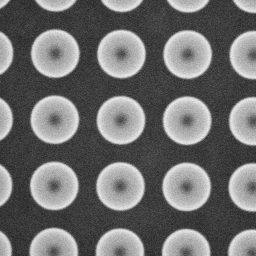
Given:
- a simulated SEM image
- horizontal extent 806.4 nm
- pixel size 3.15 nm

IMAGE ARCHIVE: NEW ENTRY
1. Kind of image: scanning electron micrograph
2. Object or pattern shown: an array of small figures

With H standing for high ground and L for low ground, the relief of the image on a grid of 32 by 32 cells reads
HLLLLHHHHLLLLHHHHLLLLHHHHHLLLHHH
LLLLLLLLLLLLLLLLLLLLLLLLLLLLLLLL
LLLLLLLLLLLLLLLLLLLLLLLLLLLLLLLL
LLLLLLLLLLLLLLLLLLLLLLLLLLLLLLLL
HLLLLHHHHLLLLHHHHLLLLLHHHLLLLLHH
HLLLHHHHHHLLLHHHHHLLLHHHHHLLLHHH
HHLLHHHHHHLLHHHHHHLLHHHHHHLLLHHH
HHLLHHHHHHLLHHHHHHLLLHHHHHLLLHHH
HLLLLHHHHLLLLHHHHHLLLHHHHHLLLHHH
LLLLLLHHLLLLLLHHLLLLLLHHHLLLLLHH
LLLLLLLLLLLLLLLLLLLLLLLLLLLLLLLL
LLLLLLLLLLLLLLLLLLLLLLLLLLLLLLLL
LLLLLHHHLLLLLLHHHLLLLLHHHLLLLLHH
HLLLHHHHHLLLLHHHHHLLLHHHHHLLLHHH
HLLLHHHHHHLLHHHHHHLLHHHHHHLLLHHH
HLLLHHHHHHLLHHHHHHLLHHHHHHLLLHHH
HLLLHHHHHLLLLHHHHHLLLHHHHHLLLHHH
LLLLLHHHLLLLLLHHHLLLLLHHHLLLLLHH
LLLLLLLLLLLLLLLLLLLLLLLLLLLLLLLL
LLLLLLLLLLLLLLLLLLLLLLLLLLLLLLLL
LLLLLLHHLLLLLLHHLLLLLLLHLLLLLLLH
HLLLHHHHHLLLLHHHHLLLLHHHHHLLLHHH
HLLLHHHHHHLLHHHHHHLLHHHHHHLLLHHH
HLLLHHHHHHLLHHHHHHLLHHHHHHLLLHHH
HLLLHHHHHLLLHHHHHHLLLHHHHHLLLHHH
LLLLLHHHHLLLLHHHHLLLLHHHHLLLLHHH
LLLLLLLLLLLLLLLLLLLLLLLLLLLLLLLL
LLLLLLLLLLLLLLLLLLLLLLLLLLLLLLLL
LLLLLLLLLLLLLLLLLLLLLLLLLLLLLLLL
HLLLLHHHHLLLLHHHHLLLLHHHHLLLLLHH
HLLLHHHHHLLLHHHHHHLLLHHHHHLLLHHH
HLLLHHHHHHLLHHHHHHLLHHHHHHLLLHHH